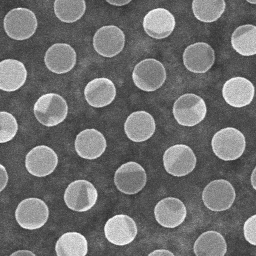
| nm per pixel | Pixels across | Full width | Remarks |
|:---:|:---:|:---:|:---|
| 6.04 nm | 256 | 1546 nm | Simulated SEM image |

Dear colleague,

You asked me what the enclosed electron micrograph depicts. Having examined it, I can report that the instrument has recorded a regular array of raised bodies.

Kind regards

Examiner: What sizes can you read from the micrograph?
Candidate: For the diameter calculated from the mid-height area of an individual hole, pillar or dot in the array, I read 0.189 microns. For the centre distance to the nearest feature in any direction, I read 0.314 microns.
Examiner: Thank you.